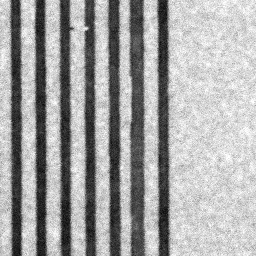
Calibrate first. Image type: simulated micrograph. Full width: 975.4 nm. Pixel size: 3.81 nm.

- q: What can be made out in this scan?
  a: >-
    parallel lines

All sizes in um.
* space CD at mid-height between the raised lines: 0.0424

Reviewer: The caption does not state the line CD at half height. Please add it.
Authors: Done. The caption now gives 52.8 nm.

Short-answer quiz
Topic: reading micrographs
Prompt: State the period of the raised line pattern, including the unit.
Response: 93.4 nm